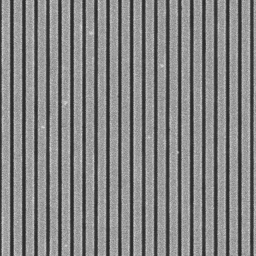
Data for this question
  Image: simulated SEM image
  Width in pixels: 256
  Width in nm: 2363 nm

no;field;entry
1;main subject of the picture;parallel lines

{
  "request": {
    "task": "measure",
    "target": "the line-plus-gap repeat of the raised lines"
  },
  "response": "111 nm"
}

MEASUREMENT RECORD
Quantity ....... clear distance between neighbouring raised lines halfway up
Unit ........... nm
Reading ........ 32.3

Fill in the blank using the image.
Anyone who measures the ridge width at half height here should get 8.75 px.